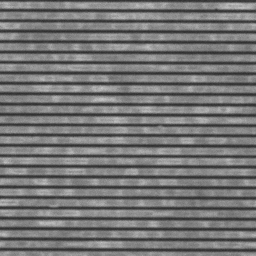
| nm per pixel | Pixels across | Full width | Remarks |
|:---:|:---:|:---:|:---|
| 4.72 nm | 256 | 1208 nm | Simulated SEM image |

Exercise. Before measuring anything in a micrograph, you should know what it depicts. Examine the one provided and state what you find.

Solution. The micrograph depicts parallel lines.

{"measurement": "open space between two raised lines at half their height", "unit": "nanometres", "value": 18.3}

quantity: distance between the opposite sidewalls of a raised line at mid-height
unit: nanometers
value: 32.5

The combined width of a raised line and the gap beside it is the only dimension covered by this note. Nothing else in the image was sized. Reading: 49.1 nm